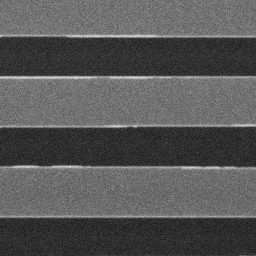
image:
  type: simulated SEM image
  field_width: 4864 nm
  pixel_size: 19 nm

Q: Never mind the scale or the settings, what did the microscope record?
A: lines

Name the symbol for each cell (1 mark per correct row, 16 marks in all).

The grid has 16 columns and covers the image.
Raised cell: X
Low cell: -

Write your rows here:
XXXXXXXXXXXXXXXX
XXXXXXXXXXXXXXXX
----------------
----------------
----------------
XXXXXXXXXXXXXXXX
XXXXXXXXXXXXXXXX
XXXXXXXXXXXXXXXX
----------------
----------------
XXXXXXXXXXXXXXX-
XXXXXXXXXXXXXXXX
XXXXXXXXXXXXXXXX
XXXXXXXXXXXXXXXX
----------------
----------------